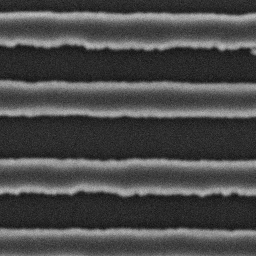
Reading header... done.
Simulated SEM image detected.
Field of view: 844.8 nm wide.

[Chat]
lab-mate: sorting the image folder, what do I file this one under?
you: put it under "lines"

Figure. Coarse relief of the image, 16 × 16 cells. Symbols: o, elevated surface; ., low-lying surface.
................
oooooooooooooooo
oooooooooooooooo
................
................
oooooooooooooooo
oooooooooooooooo
................
................
................
oooooooooooooooo
oooooooooooooooo
................
................
oooooooooooooooo
oooooooooooooooo